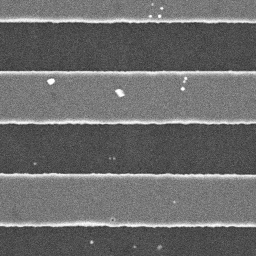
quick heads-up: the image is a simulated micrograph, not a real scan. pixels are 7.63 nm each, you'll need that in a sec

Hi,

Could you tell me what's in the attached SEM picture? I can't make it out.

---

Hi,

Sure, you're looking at lines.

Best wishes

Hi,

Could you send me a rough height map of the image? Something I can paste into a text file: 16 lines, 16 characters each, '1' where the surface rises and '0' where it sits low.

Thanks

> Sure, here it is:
1111111111111111
0000000000000000
0000000000000000
0000000000000000
1111111111111111
1111111111111111
1111111111111111
1111111111111111
0000000000000000
0000000000000000
0000000000000000
1111111111111111
1111111111111111
1111111111111111
0000000000000000
0000000000000000